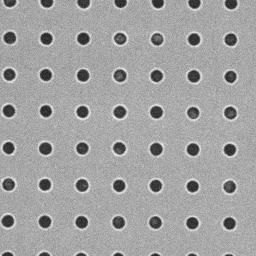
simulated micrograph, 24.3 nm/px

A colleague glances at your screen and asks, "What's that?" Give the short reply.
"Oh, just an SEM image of a regular array of holes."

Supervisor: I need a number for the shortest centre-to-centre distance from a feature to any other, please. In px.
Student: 36.5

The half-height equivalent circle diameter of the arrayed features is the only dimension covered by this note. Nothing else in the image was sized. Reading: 326 nm